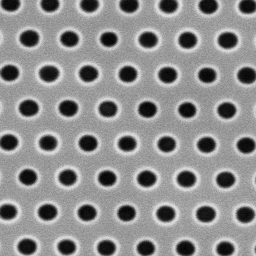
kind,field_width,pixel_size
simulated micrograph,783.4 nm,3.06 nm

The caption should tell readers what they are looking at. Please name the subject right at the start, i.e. a regular array of holes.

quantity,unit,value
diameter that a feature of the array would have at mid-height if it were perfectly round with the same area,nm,57.5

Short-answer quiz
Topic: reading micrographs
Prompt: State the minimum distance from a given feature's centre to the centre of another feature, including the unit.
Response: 0.121 microns